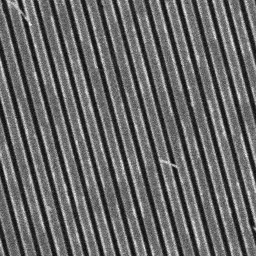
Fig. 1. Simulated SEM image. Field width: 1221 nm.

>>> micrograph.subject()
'parallel lines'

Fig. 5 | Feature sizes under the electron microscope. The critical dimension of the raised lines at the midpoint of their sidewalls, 0.0479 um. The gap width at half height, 27.7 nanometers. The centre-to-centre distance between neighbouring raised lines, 73.1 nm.